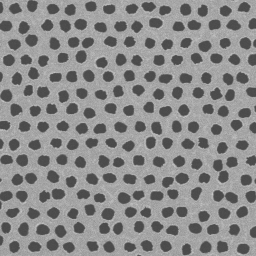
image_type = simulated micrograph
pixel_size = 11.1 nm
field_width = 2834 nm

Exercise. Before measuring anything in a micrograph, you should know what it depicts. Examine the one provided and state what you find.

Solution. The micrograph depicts a regular array of holes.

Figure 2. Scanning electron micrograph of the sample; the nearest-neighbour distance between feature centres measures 182 nm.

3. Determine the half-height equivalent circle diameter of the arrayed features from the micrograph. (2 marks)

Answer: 122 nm